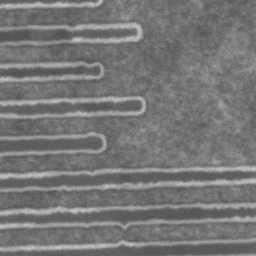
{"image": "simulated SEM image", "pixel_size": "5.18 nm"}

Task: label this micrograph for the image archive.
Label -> parallel lines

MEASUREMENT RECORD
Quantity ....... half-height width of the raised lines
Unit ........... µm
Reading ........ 0.0834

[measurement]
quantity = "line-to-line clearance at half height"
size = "0.107 um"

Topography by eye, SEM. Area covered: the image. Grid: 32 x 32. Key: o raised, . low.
oooooooooooo....................
................................
................................
...oooooooooooooo...............
ooooooooooooooooo...............
o...o...........................
................................
................................
ooooooooooooo...................
ooooooooooooo...................
................................
................................
.......ooooooooooo..............
oooooooooooooooooo..............
ooooo..o........................
................................
................................
ooooooooooooo...................
ooooooooooooo...................
................................
................................
............oooooooooooooooooooo
oooooooooooooooooooooooooooooooo
ooooooooooo.o...................
................................
...............................o
.ooooooooooooooooooooooooooooooo
oooooooooooooooooooooooooooo.ooo
o...............................
................................
...............oo.oo.ooooooooooo
oooooooooooooooooooooooooooooooo